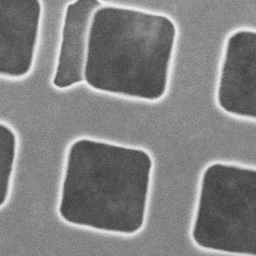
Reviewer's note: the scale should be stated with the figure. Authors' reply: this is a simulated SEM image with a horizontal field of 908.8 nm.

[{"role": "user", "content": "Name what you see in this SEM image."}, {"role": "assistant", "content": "holes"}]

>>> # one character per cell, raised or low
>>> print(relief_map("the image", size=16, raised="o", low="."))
..oooo.ooooooooo
..oooo.....ooooo
..ooo......ooo..
..ooo......ooo..
..ooo......ooo..
oooooo....oooo..
oooooooooooooo..
oooooooooooooooo
.ooooooooooooooo
.ooo.....ooooooo
.ooo.....oooo..o
.ooo.....oooo...
oooo.....ooo....
oooo.....ooo....
oooooooooooo....
ooooooooooooo...